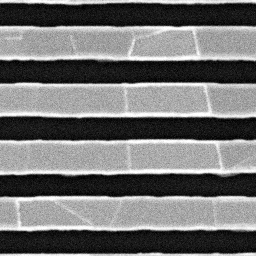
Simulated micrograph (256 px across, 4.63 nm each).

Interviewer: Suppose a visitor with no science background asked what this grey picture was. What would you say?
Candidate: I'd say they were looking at lines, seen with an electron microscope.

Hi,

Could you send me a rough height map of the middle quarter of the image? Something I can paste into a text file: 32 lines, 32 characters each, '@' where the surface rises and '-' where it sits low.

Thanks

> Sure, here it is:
--------------------------------
--------------------------------
--------------------------------
--------------------------------
--------------------------------
@@@@@@@@@@@@@@@@@@@@@@@@@@@@@@@@
@@@@@@@@@@@@@@@@@@@@@@@@@@@@@@@@
@@@@@@@@@@@@@@@@@@@@@@@@@@@@@@@@
@@@@@@@@@@@@@@@@@@@@@@@@@@@@@@@@
@@@@@@@@@@@@@@@@@@@@@@@@@@@@@@@@
@@@@@@@@@@@@@@@@@@@@@@@@@@@@@@@@
@@@@@@@@@@@@@@@@@@@@@@@@@@@@@@@@
@@@@@@@@@@@@@@@@@@@@@@@@@@@@@@@@
--------------------------------
--------------------------------
--------------------------------
--------------------------------
--------------------------------
--------------------------------
@@@@@@@@@@@@@@@@@@@@@@@@@@@@@@@@
@@@@@@@@@@@@@@@@@@@@@@@@@@@@@@@@
@@@@@@@@@@@@@@@@@@@@@@@@@@@@@@@@
@@@@@@@@@@@@@@@@@@@@@@@@@@@@@@@@
@@@@@@@@@@@@@@@@@@@@@@@@@@@@@@@@
@@@@@@@@@@@@@@@@@@@@@@@@@@@@@@@@
@@@@@@@@@@@@@@@@@@@@@@@@@@@@@@@@
@@@@@@@@@@@@@@@@@@@@@@@@@@@@@@@@
-@@@-----@@@--------------------
--------------------------------
--------------------------------
--------------------------------
--------------------------------